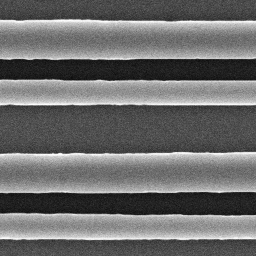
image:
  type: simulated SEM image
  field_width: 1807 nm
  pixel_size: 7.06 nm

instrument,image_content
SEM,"lines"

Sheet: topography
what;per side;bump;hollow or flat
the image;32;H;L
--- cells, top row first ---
LLLLLLLLLLLLLLLLLLLLLLLLLLLLLLLL
LLLLLLLLLLLLLLLLLLLLLLLLLLLLLLLL
LLLLLLLLLLLLLLLLLLLLLLLLLLLLLLLL
HHHHHHHHHHHHHHHHHHHHHHHHHHHHHHHH
HHHHHHHHHHHHHHHHHHHHHHHHHHHHHHHH
HHHHHHHHHHHHHHHHHHHHHHHHHHHHHHHH
HHHHHHHHHHHHHHHHHHHHHHHHHHHHHHHH
LLLLLLLLLLLLLLLLLLLLLLLLLLLLLLLL
LLLLLLLLLLLLLLLLLLLLLLLLLLLLLLLL
LLLLLLLLLLLLLLLLLLLLLLLLLLLLLLLL
HHHHHHHHHHHHHHHHHHHHHHHHHHHHHHHH
HHHHHHHHHHHHHHHHHHHHHHHHHHHHHHHH
HHHHHHHHHHHHHHHHHHHHHHHHHHHHHHHH
LLLLLLLLLLLLLLLLLLLLLLLLLLLLLLLL
LLLLLLLLLLLLLLLLLLLLLLLLLLLLLLLL
LLLLLLLLLLLLLLLLLLLLLLLLLLLLLLLL
LLLLLLLLLLLLLLLLLLLLLLLLLLLLLLLL
LLLLLLLLLLLLLLLLLLLLLLLLLLLLLLLL
LLLLLLLLLLLLLLLLLLLLLLLLLLLLLLLL
HHHHHHHHHHHHHHHHHHHHHHHHHHHHHHHH
HHHHHHHHHHHHHHHHHHHHHHHHHHHHHHHH
HHHHHHHHHHHHHHHHHHHHHHHHHHHHHHHH
HHHHHHHHHHHHHHHHHHHHHHHHHHHHHHHH
HHHHHHHHHHHHHHHHHHHHHHHHHHHHHHHH
LLLLLLLLLLLLLLLLLLLLLLLLLLLLLLLL
LLLLLLLLLLLLLLLLLLLLLLLLLLLLLLLL
LLLLLLLLLLLLLLLLLLLLLLLLLLLLLLLL
HHHHHHHHHHHHHHHHHHHHHHHHHHHHHHHH
HHHHHHHHHHHHHHHHHHHHHHHHHHHHHHHH
HHHHHHHHHHHHHHHHHHHHHHHHHHHHHHHH
LLLLLLLLLLLLLLLLLLLLLLLLLLLLLLLL
LLLLLLLLLLLLLLLLLLLLLLLLLLLLLLLL